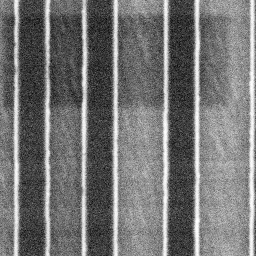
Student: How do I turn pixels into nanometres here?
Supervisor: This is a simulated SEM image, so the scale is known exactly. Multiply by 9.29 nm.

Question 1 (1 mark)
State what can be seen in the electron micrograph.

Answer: lines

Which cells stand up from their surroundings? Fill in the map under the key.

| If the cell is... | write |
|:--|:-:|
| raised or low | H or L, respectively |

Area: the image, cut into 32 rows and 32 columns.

LLHHHHLLLLHHHHHLLLLLLHHHHLLLLLLH
LLHHHHLLLLHHHHHLLLLLLHHHHLLLLLLH
LLHHHHLLLLHHHHHLLLLLLHHHHLLLLLLH
LLHHHHLLLLHHHHHLLLLLLHHHHLLLLLLH
LLHHHHLLLLHHHHHLLLLLLHHHHLLLLLLH
LLHHHHLLLLHHHHHLLLLLLHHHHLLLLLLH
LLHHHHLLLLHHHHHLLLLLLHHHHLLLLLLH
LLHHHHLLLLHHHHHLLLLLLHHHHLLLLLLH
LLHHHHLLLLHHHHHLLLLLLHHHHLLLLLLH
LLHHHHLLLLHHHHHLLLLLLHHHHLLLLLLH
LLHHHHLLLLHHHHHLLLLLLHHHHLLLLLLH
LLHHHHLLLLHHHHHLLLLLLHHHHLLLLLLH
LLHHHHLLLLHHHHHLLLLLLHHHHLLLLLLH
LLHHHHLLLLHHHHHLLLLLLHHHHLLLLLLH
LLHHHHLLLLHHHHHLLLLLLHHHHLLLLLLH
LLHHHHLLLLHHHHHLLLLLLHHHHLLLLLLH
LLHHHHLLLLHHHHHLLLLLLHHHHLLLLLLH
LLHHHHLLLLHHHHLLLLLLLHHHHLLLLLLH
LLHHHHLLLLHHHHHLLLLLLHHHHLLLLLLH
LLHHHHLLLLHHHHHLLLLLLHHHHLLLLLLH
LLHHHHLLLLHHHHHLLLLLLHHHHLLLLLLH
LLHHHHLLLLHHHHHLLLLLLHHHHLLLLLLH
LLHHHHLLLLHHHHHLLLLLLHHHHLLLLLLH
LLHHHHLLLLHHHHHLLLLLLHHHHLLLLLLH
LLHHHHLLLLHHHHHLLLLLLHHHHLLLLLLH
LLHHHHLLLLHHHHHLLLLLLHHHHLLLLLLH
LLHHHHLLLLHHHHHLLLLLLHHHHLLLLLLH
LLHHHHLLLLHHHHHLLLLLLHHHHLLLLLLH
LLHHHHLLLLHHHHHLLLLLLHHHHLLLLLLH
LLHHHHLLLLHHHHLLLLLLLHHHHLLLLLLH
LLHHHHLLLLHHHHHLLLLLLHHHHLLLLLLH
LLHHHHLLLLHHHHLLLLLLLHHHHLLLLLLH